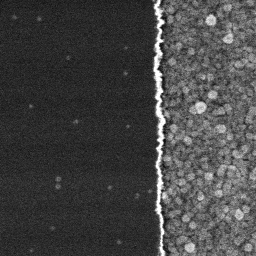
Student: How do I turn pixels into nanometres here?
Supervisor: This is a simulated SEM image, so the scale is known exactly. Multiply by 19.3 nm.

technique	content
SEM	one or a few lines or trenches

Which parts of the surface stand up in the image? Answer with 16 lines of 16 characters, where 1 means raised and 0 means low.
1111111111000000
1111111111000000
1111111111000000
1111111111000000
1111111111000000
1111111111000000
1111111111000000
1111111111000000
1111111111000000
1111111111000000
1111111111000000
1111111111000000
1111111111000000
1111111111000000
1111111111000000
1111111111000000